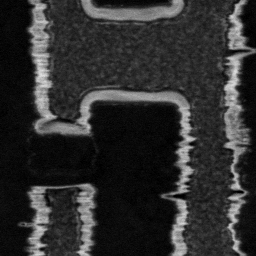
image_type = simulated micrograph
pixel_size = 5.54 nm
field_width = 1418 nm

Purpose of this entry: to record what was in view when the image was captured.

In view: one or a few lines or trenches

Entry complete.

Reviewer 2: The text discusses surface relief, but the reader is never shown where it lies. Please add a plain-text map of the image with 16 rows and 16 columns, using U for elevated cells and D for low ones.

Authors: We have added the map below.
UUDDDDUUUUUDDDDU
UUDDDDDDDDDDDDDU
UUUDDDDDDDDDDDDU
UUUDDDDDDDDDDDDU
UUUDDDDDDDDDDDDU
UUUDDDDDDDDDDDUU
UUUDDUUUUUUDDDUU
UUUDDUUUUUUUDDUU
UUUUUUUUUUUUDDUU
UUUUUUUUUUUUDDDU
UUUUUUUUUUUUDDUU
UUUUUUUUUUUUDDDU
UUDDDUUUUUUDDDDU
UUUDDUUUUUUDDDDU
UUDDDUUUUUUDDDUU
UUDDDUUUUUUDDDDU